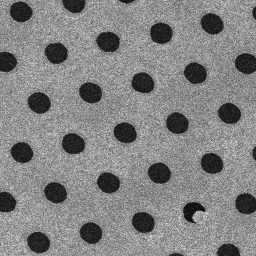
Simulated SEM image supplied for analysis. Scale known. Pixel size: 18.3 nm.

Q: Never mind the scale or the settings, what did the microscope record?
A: a regular array of holes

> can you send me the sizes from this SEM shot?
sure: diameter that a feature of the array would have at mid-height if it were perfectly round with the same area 407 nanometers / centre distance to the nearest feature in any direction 0.953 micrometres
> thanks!